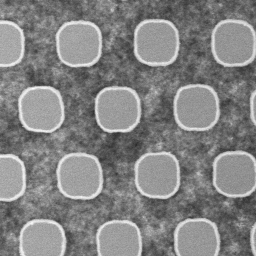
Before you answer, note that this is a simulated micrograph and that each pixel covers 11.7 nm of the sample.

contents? raised bodies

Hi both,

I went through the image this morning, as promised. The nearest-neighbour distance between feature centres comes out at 893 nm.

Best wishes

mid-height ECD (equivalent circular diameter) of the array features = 0.546 µm